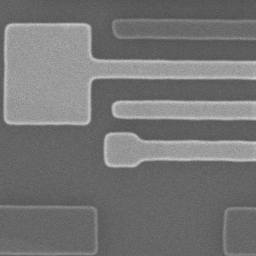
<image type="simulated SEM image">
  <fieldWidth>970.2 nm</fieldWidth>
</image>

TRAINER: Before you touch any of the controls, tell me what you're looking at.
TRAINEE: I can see wiring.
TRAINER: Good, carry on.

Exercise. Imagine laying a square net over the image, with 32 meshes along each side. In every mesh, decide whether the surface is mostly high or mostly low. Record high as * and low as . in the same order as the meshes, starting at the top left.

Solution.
................................
................................
...............*********........
.**********...******************
.**********....*****************
.**********.....................
.**********.....................
.************...................
.*******************************
.*******************************
.**********.....................
.**********.....................
.**********.....................
.**********...******************
.**********...******************
.*******.**.....................
................................
.............*****..............
.............*******************
.............*******************
.............****...............
................................
................................
................................
................................
................................
************................****
************................****
************................****
************................****
************................****
************................****